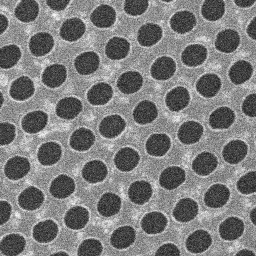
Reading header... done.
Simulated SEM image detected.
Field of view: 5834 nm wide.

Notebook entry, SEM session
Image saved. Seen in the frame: a regular array of holes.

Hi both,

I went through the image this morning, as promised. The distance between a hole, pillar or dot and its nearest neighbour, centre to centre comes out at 772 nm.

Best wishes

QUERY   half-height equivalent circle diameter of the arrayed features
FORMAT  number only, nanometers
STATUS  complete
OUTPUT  585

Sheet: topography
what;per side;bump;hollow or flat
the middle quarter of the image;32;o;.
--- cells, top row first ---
ooo......ooooooooooooo......oo..
.oo.....oooooooooooooo......oooo
.ooo...ooooooo.....ooo......oooo
.oooooooooooo.......oo.....ooooo
ooooooooo.ooo.......oooooooooooo
ooooooo.....o.......oooooooo.ooo
oooooo......oo.....oooooooo....o
ooooo.......ooo..ooooooooo.....o
....oo......ooooooooooooo.......
....oo.....oooooooo...ooo......o
.....ooo.ooooooooo.....oo......o
.....oooooooooooo.......oo....oo
....oooooooo..ooo.......oooooooo
...ooooooo.....oo......ooooooooo
ooooooooo......ooo....oooooooo..
ooooooooo.......ooooooooooooo...
ooo....oo......ooooooooooooo....
oo......o.....oooooooo....oo....
o.......oo...oooooooo......o....
o.......oooooooooooo.......oo...
o......ooooooooooooo.......ooooo
oo....oooooooo....oo......oooooo
ooooooooooooo......oo....ooooooo
oooooooooooo.......ooooooooooooo
oooooo....oo.......ooooooooooooo
ooooo......oo.....ooooooooo..ooo
oooo.......ooo...oooooooo.....oo
oooo.......ooooooooooooo.......o
..ooo......ooooooooooooo......oo
...ooo....ooooooo....ooo......oo
...ooooooooooooo......oo.....ooo
...ooooooooooooo......oooo.ooooo